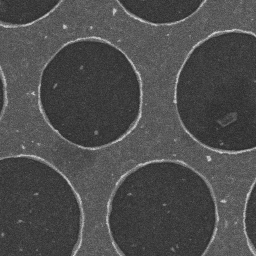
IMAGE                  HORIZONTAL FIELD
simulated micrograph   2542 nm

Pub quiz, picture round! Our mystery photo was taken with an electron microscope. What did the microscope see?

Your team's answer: holes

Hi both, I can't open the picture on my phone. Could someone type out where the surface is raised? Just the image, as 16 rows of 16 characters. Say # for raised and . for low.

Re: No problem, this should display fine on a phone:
...#####....####
..##############
#####.#######...
###.....####....
###.....###.....
###......##.....
###......##.....
###.....###.....
####....####....
################
...######...####
....###......###
.....##......##.
.....##......##.
.....##......##.
.....##......###